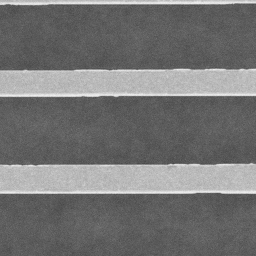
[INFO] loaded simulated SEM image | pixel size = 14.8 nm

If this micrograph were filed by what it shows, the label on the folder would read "lines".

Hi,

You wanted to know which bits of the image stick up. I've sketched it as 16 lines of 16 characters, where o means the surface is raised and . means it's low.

................
................
................
................
oooooooooooooooo
oooooooooooooooo
................
................
................
................
oooooooooooooooo
oooooooooooooooo
................
................
................
................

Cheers